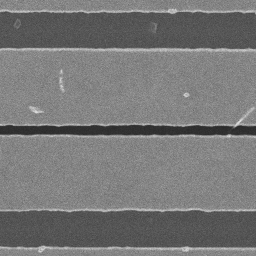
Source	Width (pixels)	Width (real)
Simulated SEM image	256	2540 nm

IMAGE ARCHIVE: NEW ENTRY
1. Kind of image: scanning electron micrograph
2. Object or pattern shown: lines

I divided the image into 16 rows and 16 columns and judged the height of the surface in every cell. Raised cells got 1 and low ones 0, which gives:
1111111111111111
0000000000000000
0000000000000000
1111111111111111
1111111111111111
1111111111111111
1111111111111111
1111111111111111
1111111111111111
1111111111111111
1111111111111111
1111111111111111
1111111111111111
0000000000000000
0000000000000000
1111101110010000